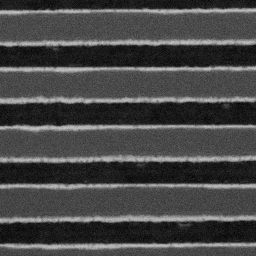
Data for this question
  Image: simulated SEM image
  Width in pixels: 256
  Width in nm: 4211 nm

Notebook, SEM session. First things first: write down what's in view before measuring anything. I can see lines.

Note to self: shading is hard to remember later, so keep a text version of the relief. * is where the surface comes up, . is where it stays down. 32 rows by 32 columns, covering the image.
................................
********************************
********************************
********************************
********************************
*************.*...**............
................................
................................
..............****....***.******
********************************
********************************
********************************
********************************
................................
................................
................................
********************************
********************************
********************************
********************************
................................
................................
................................
********************************
********************************
********************************
********************************
********.**..**.................
................................
................................
................................
********************************